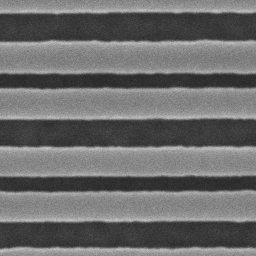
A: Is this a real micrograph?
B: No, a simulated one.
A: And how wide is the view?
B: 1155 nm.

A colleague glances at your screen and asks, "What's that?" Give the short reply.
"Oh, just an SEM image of lines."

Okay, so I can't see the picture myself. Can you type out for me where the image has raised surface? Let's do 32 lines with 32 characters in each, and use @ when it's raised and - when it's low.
@@@@@@@@@@@@@@@@@@@@@@@@@@@@@@@@
@@@@@@@@@@@@@@-------@@---@@-@@@
--------------------------------
--------------------------------
--------------------------------
@@@@@@@@@@@@@@@@@@@@@@@@@@@@@@@@
@@@@@@@@@@@@@@@@@@@@@@@@@@@@@@@@
@@@@@@@@@@@@@@@@@@@@@@@@@@@@@@@@
@@@@@@@@@@@@@@@@@@@@@@@@@@@@@@@@
--------------------------------
--------------------------------
@@@@@@@@@@@@@@@@@@@@@@@@@@@@@@@@
@@@@@@@@@@@@@@@@@@@@@@@@@@@@@@@@
@@@@@@@@@@@@@@@@@@@@@@@@@@@@@@@@
@@@@@@@@@@@@@@@@@@@@@@@@@@@@@@@@
--------------------------------
--------------------------------
--------------------------------
@@@@@@@@@@@@@@@@@@@@@@@@@@@@@@@@
@@@@@@@@@@@@@@@@@@@@@@@@@@@@@@@@
@@@@@@@@@@@@@@@@@@@@@@@@@@@@@@@@
@@@@@@@@@@@@@@@@@@@@@@@@@@@@@@@@
--------------------------------
--------------------------------
@@@@@@@@@@@@@@@@@@@@@@@@@@@@@@@@
@@@@@@@@@@@@@@@@@@@@@@@@@@@@@@@@
@@@@@@@@@@@@@@@@@@@@@@@@@@@@@@@@
@@@@@@@@@@@@@@@@@@@@@@@@@@@@@@@@
--------------------------------
--------------------------------
--------------------------------
@@@@@@@@@@@@@@@@@@@@@@@@@@@@@@@@